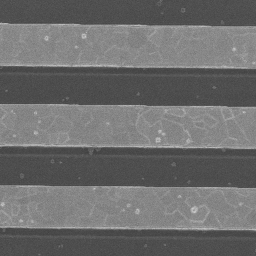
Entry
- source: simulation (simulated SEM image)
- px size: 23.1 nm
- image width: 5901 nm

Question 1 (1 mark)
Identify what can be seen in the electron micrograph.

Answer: lines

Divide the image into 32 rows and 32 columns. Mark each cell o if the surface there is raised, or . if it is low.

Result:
................................
................................
................................
oooooooooooooooooooooooooooooooo
oooooooooooooooooooooooooooooooo
oooooooooooooooooooooooooooooooo
oooooooooooooooooooooooooooooooo
oooooooooooooooooooooooooooooooo
.............................ooo
................................
................................
................................
................................
oooooooooooooooooooooooooooooooo
oooooooooooooooooooooooooooooooo
oooooooooooooooooooooooooooooooo
oooooooooooooooooooooooooooooooo
oooooooooooooooooooooooooooooooo
.............................ooo
................................
................................
................................
................................
oooooooooooooooooooooooooooooo..
oooooooooooooooooooooooooooooooo
oooooooooooooooooooooooooooooooo
oooooooooooooooooooooooooooooooo
oooooooooooooooooooooooooooooooo
...............ooooooooooooooooo
................................
................................
................................